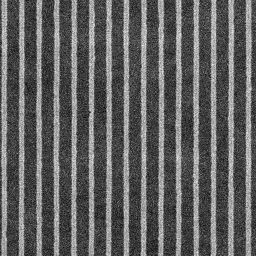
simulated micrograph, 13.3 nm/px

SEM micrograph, parallel lines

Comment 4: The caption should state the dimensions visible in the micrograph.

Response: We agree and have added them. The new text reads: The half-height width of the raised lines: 58.3 nanometers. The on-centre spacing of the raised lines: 232 nm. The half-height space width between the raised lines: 173 nanometers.